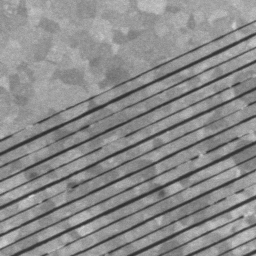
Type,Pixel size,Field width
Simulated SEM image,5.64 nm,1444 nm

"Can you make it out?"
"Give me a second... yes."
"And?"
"parallel lines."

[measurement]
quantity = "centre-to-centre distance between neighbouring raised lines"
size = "0.0695 um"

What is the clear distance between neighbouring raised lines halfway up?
14 nm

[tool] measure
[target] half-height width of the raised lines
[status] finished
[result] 56.1 nm